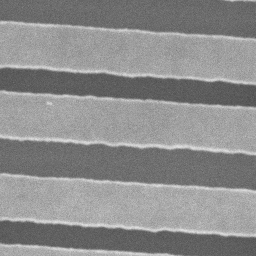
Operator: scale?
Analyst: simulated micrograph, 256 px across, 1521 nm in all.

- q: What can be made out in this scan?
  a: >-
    lines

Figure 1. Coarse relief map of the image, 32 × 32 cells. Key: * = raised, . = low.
................................
................................
................................
************....................
*****************************...
********************************
********************************
********************************
...*****************************
...............*****************
...............................*
*...............................
*******************.............
********************************
********************************
********************************
********************************
..*.****************************
....................**.*********
................................
................................
................................
************....................
***************************.....
********************************
********************************
********************************
********************************
...............*****************
............................****
*...............................
****************................